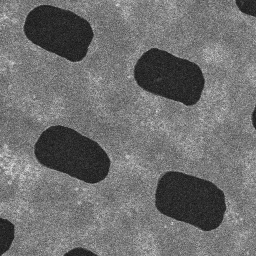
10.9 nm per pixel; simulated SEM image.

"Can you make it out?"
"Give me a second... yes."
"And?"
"holes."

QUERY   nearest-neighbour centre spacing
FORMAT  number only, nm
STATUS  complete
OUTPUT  1320